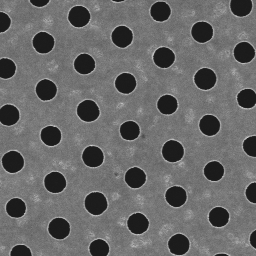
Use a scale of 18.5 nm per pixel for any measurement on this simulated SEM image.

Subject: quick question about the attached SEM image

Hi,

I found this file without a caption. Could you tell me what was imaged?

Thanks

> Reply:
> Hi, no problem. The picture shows a regular array of holes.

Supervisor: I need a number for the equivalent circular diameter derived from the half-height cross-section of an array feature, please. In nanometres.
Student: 393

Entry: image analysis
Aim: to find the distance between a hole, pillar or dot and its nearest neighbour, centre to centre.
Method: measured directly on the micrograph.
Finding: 45.6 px